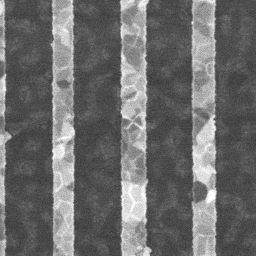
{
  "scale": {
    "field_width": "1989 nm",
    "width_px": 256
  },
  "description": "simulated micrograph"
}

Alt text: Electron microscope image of one or a few lines or trenches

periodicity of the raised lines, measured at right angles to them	544	nm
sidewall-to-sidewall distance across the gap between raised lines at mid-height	369	nm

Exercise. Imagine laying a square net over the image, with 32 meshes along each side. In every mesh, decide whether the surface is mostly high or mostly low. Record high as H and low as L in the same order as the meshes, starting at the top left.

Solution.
LLLLLLLHHLLLLLLHHHLLLLLLHHHLLLLL
HLLLLLLHHLLLLLLHHHLLLLLLHHHLLLLL
HLLLLLLHHLLLLLLHHHLLLLLLHHHLLLLL
HLLLLLLHHLLLLLLHHHLLLLLLHHHLLLLL
HLLLLLLHHLLLLLLHHHLLLLLLHHHLLLLL
HLLLLLLHHLLLLLLHHHLLLLLLHHHLLLLL
HLLLLLLHHLLLLLLHHHLLLLLLHHHLLLLL
HLLLLLLHHLLLLLLHHHLLLLLLHHHLLLLL
HLLLLLLHHLLLLLLHHHLLLLLLHHLLLLLL
HLLLLLLHHLLLLLLHHHLLLLLLHHHLLLLL
HLLLLLLHHLLLLLLHHHLLLLLLHHHLLLLL
HLLLLLLHHLLLLLLHHHLLLLLLHHHLLLLL
HLLLLLLHHLLLLLLHHHLLLLLLHHHLLLLL
HLLLLLLHHLLLLLLHHHLLLLLLHHHLLLLL
HLLLLLLHHLLLLLLHHHLLLLLLHHHLLLLL
HLLLLLLHHLLLLLLHHHLLLLLLHHHLLLLL
HLLLLLLHHLLLLLLHHHLLLLLLHHHLLLLL
HLLLLLLHHLLLLLLHHHLLLLLLHHHLLLLL
HLLLLLLHHLLLLLLHHHLLLLLLHHHLLLLL
HLLLLLLHHLLLLLLHHHLLLLLLHHHLLLLL
HLLLLLLHHLLLLLLHHHLLLLLLHHHLLLLL
HLLLLLLHHLLLLLLHHHLLLLLLHHHLLLLL
LLLLLLLHHLLLLLLHHHLLLLLLHHHLLLLL
LLLLLLLHHLLLLLLHHHLLLLLLHHHLLLLL
LLLLLLLHHLLLLLLHHHLLLLLLHHHLLLLL
LLLLLLLHHLLLLLLHHHLLLLLLHHHLLLLL
LLLLLLLHHLLLLLLHHHLLLLLLLHHLLLLL
LLLLLLLHHLLLLLLHHHLLLLLLHHHLLLLL
HLLLLLLHHLLLLLLHHHLLLLLLHHHLLLLL
HLLLLLLHHLLLLLLHHHLLLLLLHHHLLLLL
HLLLLLLHHLLLLLLHHHLLLLLLHHHLLLLL
HLLLLLLHHLLLLLLHHHHLLLLLHHHLLLLL